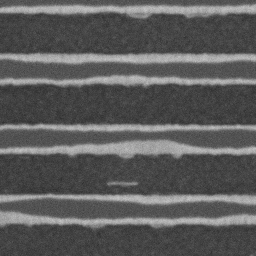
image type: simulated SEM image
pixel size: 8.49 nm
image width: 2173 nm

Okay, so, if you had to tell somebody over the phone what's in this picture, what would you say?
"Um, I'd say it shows lines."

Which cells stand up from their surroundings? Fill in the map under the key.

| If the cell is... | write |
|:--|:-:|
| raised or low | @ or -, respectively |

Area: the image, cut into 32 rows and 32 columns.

@@@@@@@@@@@@@@@@@@@@@@@@@@@@@@@@
--------------------------------
--------------------------------
--------------------------------
--------------------------------
--------------------------------
--------------------------------
@@@@@@@@@@@@@@@@@@@@@@@@@@@@@@@@
@@@@@@@@@@@@@@@@@@@@@@@@@@@@@@@@
@@@@@@@@@@@@@@@@@@@@@@@@@@@@@@@@
--------------------------------
--------------------------------
--------------------------------
--------------------------------
--------------------------------
--------------------------------
@@@@@@@@@@@@@@@@@@@@@@@@@@@@@@@@
@@@@@@@@@@@@@@@@@@@@@@@@@@@@@@@@
@@@@@@@@@@@@@@@@@@@@-@@@@@@@@@@@
--------------------------------
--------------------------------
--------------------------------
--------------------------------
--------------------------------
-----@@-------------------------
@@@@@@@@@@@@@@@@@@@@@@@@@@@@@@@@
@@@@@@@@@@@@@@@@@@@@@@@@@@@@@@@@
--@@@@@@@@@@@@@@@@@@@@@@@@@@@@@@
--------------------------------
--------------------------------
--------------------------------
--------------------------------